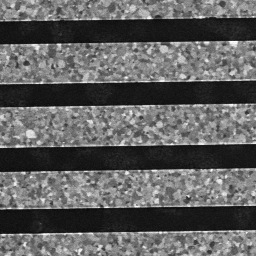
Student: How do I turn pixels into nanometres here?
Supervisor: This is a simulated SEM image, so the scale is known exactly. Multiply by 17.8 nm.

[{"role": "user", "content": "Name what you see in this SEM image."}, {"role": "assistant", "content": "one or a few lines or trenches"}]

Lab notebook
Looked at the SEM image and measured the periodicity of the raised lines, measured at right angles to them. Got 63.3 px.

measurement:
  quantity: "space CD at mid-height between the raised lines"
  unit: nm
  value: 442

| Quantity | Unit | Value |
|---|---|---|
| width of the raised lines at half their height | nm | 683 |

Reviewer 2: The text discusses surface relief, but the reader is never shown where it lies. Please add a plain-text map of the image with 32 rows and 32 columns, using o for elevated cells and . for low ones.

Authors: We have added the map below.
oooooooooooooooooooooooooooooooo
oooooooooooooooooooooooooooooooo
oo..............................
................................
................................
..............oooooooooooooooooo
oooooooooooooooooooooooooooooooo
oooooooooooooooooooooooooooooooo
oooooooooooooooooooooooooooooooo
oooooooooooooooooooooooooooooooo
................................
................................
................................
.....ooooooooooooooooooooooooooo
oooooooooooooooooooooooooooooooo
oooooooooooooooooooooooooooooooo
oooooooooooooooooooooooooooooooo
oooooooooooooooooooooooooooooooo
................................
................................
................................
..........oooooooooooooooooooooo
oooooooooooooooooooooooooooooooo
oooooooooooooooooooooooooooooooo
oooooooooooooooooooooooooooooooo
oooooooooooooooooooooooooooooooo
................................
................................
................................
oooooooooooooooooooooooooooooooo
oooooooooooooooooooooooooooooooo
oooooooooooooooooooooooooooooooo